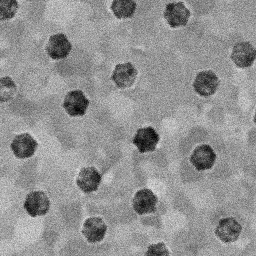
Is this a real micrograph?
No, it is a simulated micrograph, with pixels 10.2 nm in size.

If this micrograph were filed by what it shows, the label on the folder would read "a regular array of holes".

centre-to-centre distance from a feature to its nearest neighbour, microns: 0.605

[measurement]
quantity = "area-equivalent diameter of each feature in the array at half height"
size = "275 nanometres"